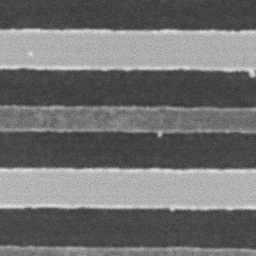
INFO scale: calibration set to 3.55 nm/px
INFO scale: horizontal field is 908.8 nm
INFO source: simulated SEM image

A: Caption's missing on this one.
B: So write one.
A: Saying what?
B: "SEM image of lines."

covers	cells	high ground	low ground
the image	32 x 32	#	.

................................
................................
................................
................................
################################
################################
################################
################################
....############################
................................
................................
................................
................................
######################..........
################################
################################
...................########.#.##
................................
................................
................................
................................
################################
################################
################################
################################
################################
................................
................................
................................
................................
................................
################################